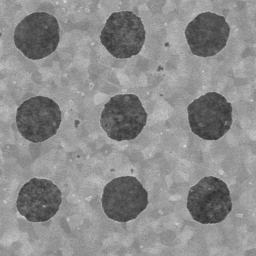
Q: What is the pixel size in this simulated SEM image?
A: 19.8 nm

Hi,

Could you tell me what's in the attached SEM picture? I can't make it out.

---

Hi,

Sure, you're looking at a regular array of holes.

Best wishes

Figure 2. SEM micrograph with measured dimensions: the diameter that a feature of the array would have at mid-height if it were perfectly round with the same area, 926 nm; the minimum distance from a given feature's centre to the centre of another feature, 1620 nanometres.